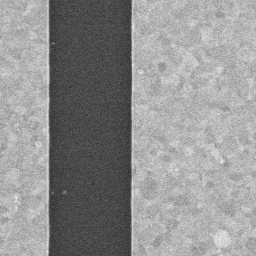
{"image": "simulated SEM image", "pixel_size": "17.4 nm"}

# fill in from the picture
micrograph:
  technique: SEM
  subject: wiring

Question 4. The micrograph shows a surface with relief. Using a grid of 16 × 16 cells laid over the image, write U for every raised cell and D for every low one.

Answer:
UUUDDDDDUUUUUUUU
UUUDDDDDUUUUUUUU
UUUDDDDDUUUUUUUU
UUUDDDDDUUUUUUUU
UUUDDDDDUUUUUUUU
UUUDDDDDUUUUUUUU
UUUDDDDDUUUUUUUU
UUUDDDDDUUUUUUUU
UUUDDDDDUUUUUUUU
UUUDDDDDUUUUUUUU
UUUDDDDDUUUUUUUU
UUUDDDDDUUUUUUUU
UUUDDDDDUUUUUUUU
UUUDDDDDUUUUUUUU
UUUDDDDDUUUUUUUU
UUUDDDDDUUUUUUUU